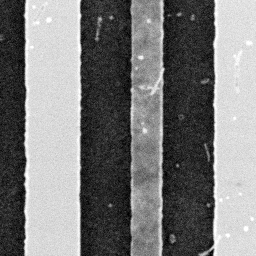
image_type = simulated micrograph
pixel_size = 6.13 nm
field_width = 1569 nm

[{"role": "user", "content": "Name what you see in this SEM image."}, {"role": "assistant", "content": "lines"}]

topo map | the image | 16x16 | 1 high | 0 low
0011100011000111
0011100011000111
0011100011000111
0011100011000111
0011100011000111
0011100011000111
0011100011000111
0011100011000111
0011100011000111
0011100011000111
0011100011000111
0011100011000111
0011100011000111
0011100011000111
0011100011000111
0011100011000111